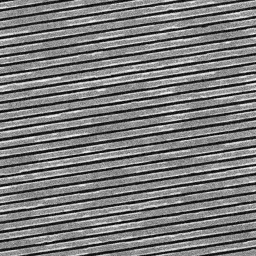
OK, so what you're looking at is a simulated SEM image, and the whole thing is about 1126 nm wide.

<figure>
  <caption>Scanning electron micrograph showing parallel lines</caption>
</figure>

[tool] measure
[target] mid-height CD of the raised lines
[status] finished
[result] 26.7 nm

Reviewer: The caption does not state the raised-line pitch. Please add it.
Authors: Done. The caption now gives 0.0402 µm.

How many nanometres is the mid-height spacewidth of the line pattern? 11.9